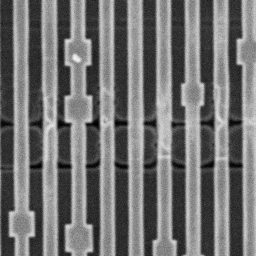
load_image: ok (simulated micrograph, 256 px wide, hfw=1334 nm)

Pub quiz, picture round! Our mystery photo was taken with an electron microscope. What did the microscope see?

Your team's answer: wiring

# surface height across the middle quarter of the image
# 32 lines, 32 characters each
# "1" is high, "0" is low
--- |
01111000011100001110000111100001
00111000011100001110000011100001
00111000011100001110000011100001
00111000011100001110000011100001
00111000011100001110000011100001
00111000011100001110000011100011
00111000011100001110000111100011
00111000011100001110000111100011
11111110011100001110000111100011
01111110011100001110000011000011
01111110011100001110000011000011
01111110011100001110000011000001
01111110011100001110000011000001
01111110011100001110000011000001
00111100011100001110000011000001
00111000011100001110000001000001
00111000011100001110000011000001
00111000011100001110000011000001
00111000011100001110000011000001
00111000011100001110000011100001
00111000011100001110000011000001
00111000011100001110000011000001
00111000011100001110000011000001
00111000011100001110000011000001
00111000011100001110000011000001
00111000011100000110000011100001
00111000011100001110000011100001
00111000011100001110000011100001
00111000011100001110000011100001
00111000011100001110000011100001
00111000011100001110000011100001
00111000011100001110000011100001